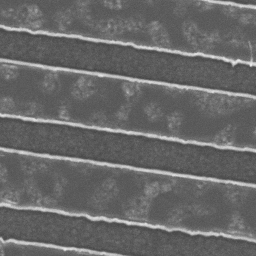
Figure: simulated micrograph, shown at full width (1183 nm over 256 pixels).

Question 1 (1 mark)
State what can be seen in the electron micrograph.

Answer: one or a few lines or trenches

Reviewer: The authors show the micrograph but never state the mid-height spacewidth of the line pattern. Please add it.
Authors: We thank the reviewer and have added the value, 150 nm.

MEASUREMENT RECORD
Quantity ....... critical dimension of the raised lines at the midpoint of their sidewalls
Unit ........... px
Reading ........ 55.8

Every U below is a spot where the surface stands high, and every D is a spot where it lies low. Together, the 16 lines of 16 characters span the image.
UUUUUUUUUUUUUUUU
UUUUUUUUUUUUUUUU
DDDDDDUUUUUUUUUU
DDDDDDDDDDDDDUUU
UUUUUDDDDDDDDDDD
UUUUUUUUUUUUDDDD
UUUUUUUUUUUUUUUU
DDUUUUUUUUUUUUUU
DDDDDDDDDUUUUUUU
UUDDDDDDDDDDDDDD
UUUUUUUUDDDDDDDD
UUUUUUUUUUUUUUUD
UUUUUUUUUUUUUUUU
DDDDDUUUUUUUUUUU
DDDDDDDDDDDDUUUU
UUUUDDDDDDDDDDDD